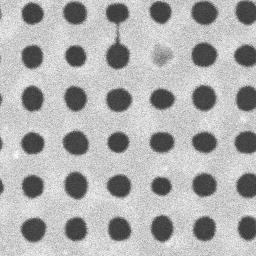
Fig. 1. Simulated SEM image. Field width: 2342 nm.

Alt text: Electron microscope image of a regular array of holes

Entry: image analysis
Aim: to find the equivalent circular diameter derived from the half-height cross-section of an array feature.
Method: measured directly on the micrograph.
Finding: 223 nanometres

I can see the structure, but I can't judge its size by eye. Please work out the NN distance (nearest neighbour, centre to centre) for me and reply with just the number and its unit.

0.388 microns